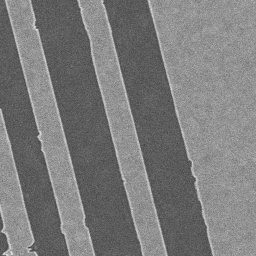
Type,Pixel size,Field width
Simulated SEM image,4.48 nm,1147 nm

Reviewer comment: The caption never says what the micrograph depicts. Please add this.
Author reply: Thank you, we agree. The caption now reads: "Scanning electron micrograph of one or a few lines or trenches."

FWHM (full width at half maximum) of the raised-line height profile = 108 nm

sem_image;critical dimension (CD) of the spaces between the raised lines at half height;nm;204